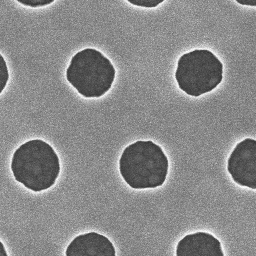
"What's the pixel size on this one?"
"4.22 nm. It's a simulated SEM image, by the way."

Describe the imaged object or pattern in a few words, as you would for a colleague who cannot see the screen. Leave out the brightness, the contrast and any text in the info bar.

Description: holes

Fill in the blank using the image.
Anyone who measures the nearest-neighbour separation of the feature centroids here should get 107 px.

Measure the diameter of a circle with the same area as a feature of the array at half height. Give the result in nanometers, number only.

202